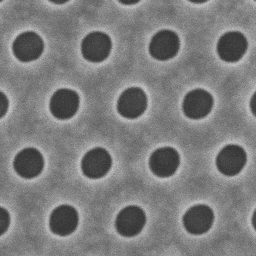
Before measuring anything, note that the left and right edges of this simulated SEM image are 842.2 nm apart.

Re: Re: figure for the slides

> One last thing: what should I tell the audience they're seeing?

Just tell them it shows a regular array of holes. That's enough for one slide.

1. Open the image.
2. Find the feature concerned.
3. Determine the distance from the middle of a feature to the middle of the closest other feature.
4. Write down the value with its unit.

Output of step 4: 216 nm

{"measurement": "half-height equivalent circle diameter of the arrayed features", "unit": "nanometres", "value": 105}